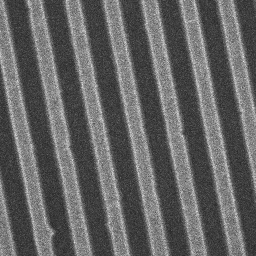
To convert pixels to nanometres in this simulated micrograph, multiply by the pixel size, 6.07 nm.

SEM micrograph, parallel lines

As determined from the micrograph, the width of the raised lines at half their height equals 99.1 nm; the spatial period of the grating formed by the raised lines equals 0.228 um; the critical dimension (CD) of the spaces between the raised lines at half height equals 130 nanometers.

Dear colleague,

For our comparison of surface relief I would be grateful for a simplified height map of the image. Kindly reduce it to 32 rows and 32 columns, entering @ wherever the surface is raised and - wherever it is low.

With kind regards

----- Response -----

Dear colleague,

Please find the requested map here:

@--@@---@@---@@---@@--@@@--@@---
@---@@--@@---@@---@@---@@--@@@--
@---@@---@@--@@---@@---@@---@@--
@---@@---@@--@@@--@@---@@---@@--
@---@@---@@---@@--@@@--@@---@@--
@@--@@---@@---@@---@@--@@@--@@--
@@---@@--@@---@@---@@---@@--@@@-
@@---@@--@@@--@@---@@---@@---@@-
@@---@@---@@---@@--@@---@@---@@-
@@---@@---@@---@@--@@@--@@---@@-
-@@--@@---@@---@@---@@--@@@--@@-
-@@---@@--@@---@@---@@---@@--@@@
-@@---@@--@@@--@@---@@---@@---@@
-@@---@@---@@--@@@--@@---@@---@@
-@@---@@---@@---@@--@@---@@---@@
-@@---@@---@@---@@---@@--@@---@@
--@@--@@@--@@---@@---@@---@@--@@
--@@---@@--@@---@@---@@---@@---@
--@@---@@---@@---@@--@@---@@---@
--@@---@@---@@---@@--@@@--@@---@
---@@--@@---@@---@@---@@--@@---@
---@@---@@--@@---@@---@@---@@--@
---@@---@@--@@---@@---@@---@@---
---@@---@@---@@---@---@@---@@---
@--@@---@@---@@---@@--@@---@@---
@---@---@@---@@---@@---@@--@@---
@---@@--@@---@@---@@---@@---@@--
@---@@---@@--@@---@@---@@---@@--
@---@@---@@---@@--@@---@@---@@--
@@--@@@--@@---@@---@@--@@---@@--
@@--@@@--@@---@@---@@---@@--@@--
@@---@@--@@---@@---@@---@@---@@-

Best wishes